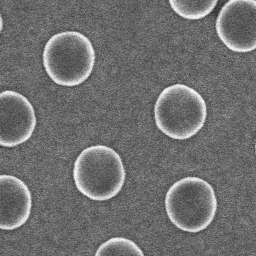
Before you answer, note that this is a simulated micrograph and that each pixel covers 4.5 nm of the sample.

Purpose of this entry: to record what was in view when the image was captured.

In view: raised bodies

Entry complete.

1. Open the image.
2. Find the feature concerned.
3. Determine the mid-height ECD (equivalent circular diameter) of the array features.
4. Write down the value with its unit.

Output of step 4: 232 nanometers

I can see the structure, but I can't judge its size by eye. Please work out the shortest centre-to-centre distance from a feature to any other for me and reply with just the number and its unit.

95.3 pixels